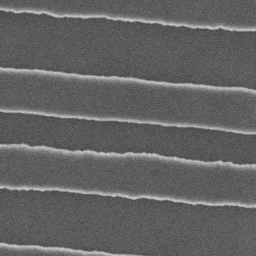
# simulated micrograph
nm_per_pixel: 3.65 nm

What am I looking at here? lines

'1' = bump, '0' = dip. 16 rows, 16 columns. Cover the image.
1111111111111111
0000000000111111
0000000000000000
0000000000000000
1110000000000000
1111111111111110
1111111111111111
0000001111111111
0000000000000000
1111110000000000
1111111111111111
1111111111111111
0000000000111111
0000000000000000
0000000000000000
1111000000000000